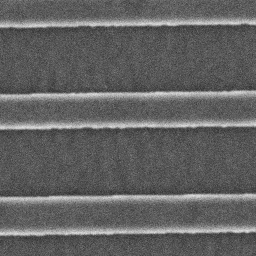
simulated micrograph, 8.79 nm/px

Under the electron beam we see lines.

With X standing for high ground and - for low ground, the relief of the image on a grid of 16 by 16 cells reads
XXXXXXXXXXXXXXXX
XXXXXXXXXXXXXXXX
----------------
----------------
----------------
----------------
XXXXXXXXXXXXXXXX
XXXXXXXXXXXXXXXX
----------------
----------------
----------------
----------------
XXXXXXXXXXXXXXXX
XXXXXXXXXXXXXXXX
XXXXXXXXXXX-X---
----------------